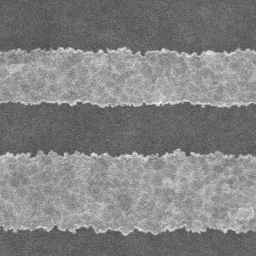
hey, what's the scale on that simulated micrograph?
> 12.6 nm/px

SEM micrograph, one or a few lines or trenches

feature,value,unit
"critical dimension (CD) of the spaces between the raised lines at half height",0.649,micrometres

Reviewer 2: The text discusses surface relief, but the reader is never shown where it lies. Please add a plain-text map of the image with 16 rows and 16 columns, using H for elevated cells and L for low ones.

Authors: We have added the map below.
LLLLLLLLLLLLLLLL
LLLLLLLLLLLLLLLL
LLLLLLLLLLLLLLLL
HHHHHHHHHHHHHHHH
HHHHHHHHHHHHHHHH
HHHHHHHHHHHHHHHH
LLLLLLHHHLLLLHHL
LLLLLLLLLLLLLLLL
LLLLLLLLLLLLLLLL
LLLLLLLLLLLLLLLL
HHHHHHHHHHHHHHHH
HHHHHHHHHHHHHHHH
HHHHHHHHHHHHHHHH
HHHHHHHHHHHHHHHH
LLLLLLLLLHLLLLLL
LLLLLLLLLLLLLLLL